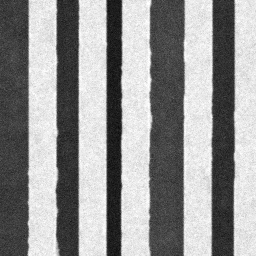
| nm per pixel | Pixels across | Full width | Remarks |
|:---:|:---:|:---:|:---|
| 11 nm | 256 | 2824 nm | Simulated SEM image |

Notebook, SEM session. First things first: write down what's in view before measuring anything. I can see lines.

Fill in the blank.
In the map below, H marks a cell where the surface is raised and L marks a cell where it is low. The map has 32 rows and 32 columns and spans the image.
LLLLHHHLLLHHHLLHHHHLLLLHHHLLLHHH
LLLLHHHLLLHHHLLHHHHLLLLHHHLLLHHH
LLLLHHHLLLHHHLLHHHHLLLLHHHLLLHHH
LLLLHHHLLLHHHLLHHHHLLLLHHHLLLHHH
LLLLHHHLLLHHHLLHHHHLLLLHHHLLLHHH
LLLLHHHLLLHHHLLHHHHLLLLHHHLLLHHH
LLLLHHHLLLHHHLLHHHHLLLLHHHLLLHHH
LLLLHHHLLLHHHLLHHHHLLLLHHHLLLHHH
LLLLHHHLLLHHHLLHHHHLLLLHHHLLLHHH
LLLLHHHLLLHHHLLHHHHLLLLHHHLLLHHH
LLLLHHHLLLHHHLLHHHHLLLLHHHLLLHHH
LLLLHHHLLLHHHLLHHHHLLLLHHHLLLHHH
LLLLHHHLLLHHHLLHHHHLLLLHHHLLLHHH
LLLLHHHLLLHHHLLHHHHLLLLHHHLLLHHH
LLLLHHHLLLHHHLLHHHHLLLLHHHLLLHHH
LLLLHHHLLLHHHLLHHHHLLLLHHHLLLHHH
LLLLHHHLLLHHHLLHHHHLLLLHHHLLLHHH
LLLLHHHLLLHHHLLHHHHLLLLHHHLLLHHH
LLLLHHHLLLHHHLLHHHHLLLLHHHLLLHHH
LLLLHHHLLLHHHLLHHHHLLLLHHHLLLHHH
LLLLHHHLLLHHHLLHHHHLLLLHHHLLLHHH
LLLLHHHLLLHHHLLHHHHLLLLHHHLLLHHH
LLLLHHHLLLHHHLLHHHHLLLLHHHLLLHHH
LLLLHHHLLLHHHLLHHHHLLLLHHHLLLHHH
LLLLHHHLLLHHHLLHHHHLLLLHHHLLLHHH
LLLLHHHLLLHHHLLHHHHLLLLHHHLLLHHH
LLLLHHHLLLHHHLLHHHHLLLLHHHLLLHHH
LLLLHHHLLLHHHLLHHHHLLLLHHHLLLHHH
LLLLHHHLLLHHHLLHHHHLLLLHHHLLLHHH
LLLLHHHLLLHHHLLHHHHLLLLHHHLLLHHH
LLLLHHHLLLHHHLLHHHHLLLLHHHLLLHHH
LLLLHHHLLLHHHLLHHHHLLLLHHHLLLHHH